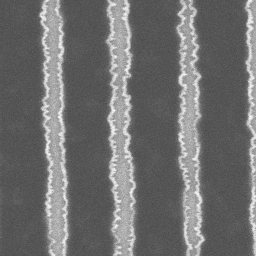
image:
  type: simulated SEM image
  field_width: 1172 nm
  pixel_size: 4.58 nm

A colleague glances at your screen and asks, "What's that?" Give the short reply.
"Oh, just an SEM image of one or a few lines or trenches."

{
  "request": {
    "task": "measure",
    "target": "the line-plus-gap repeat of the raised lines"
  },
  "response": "311 nm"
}